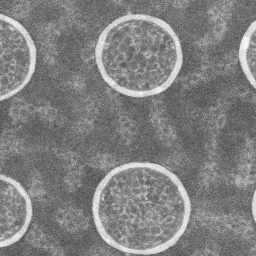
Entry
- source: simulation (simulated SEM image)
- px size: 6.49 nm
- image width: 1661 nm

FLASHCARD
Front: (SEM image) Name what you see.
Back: raised bodies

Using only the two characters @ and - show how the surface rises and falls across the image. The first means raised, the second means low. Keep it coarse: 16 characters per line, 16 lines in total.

----------------
@------@@@------
@@----@@@@@----@
@@----@@@@@----@
@@----@@@@@----@
@------@@@------
----------------
----------------
----------------
----------------
--------@@------
@-----@@@@@-----
@@----@@@@@@----
@@----@@@@@@----
@-----@@@@@-----
--------@@------